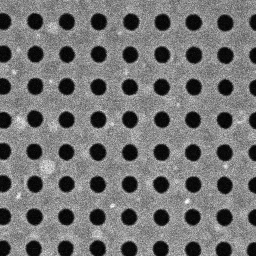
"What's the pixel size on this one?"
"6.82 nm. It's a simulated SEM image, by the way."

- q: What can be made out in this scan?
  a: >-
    a regular array of holes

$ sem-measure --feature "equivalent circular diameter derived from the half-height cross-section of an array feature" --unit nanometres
116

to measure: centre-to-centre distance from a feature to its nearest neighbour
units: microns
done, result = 0.214